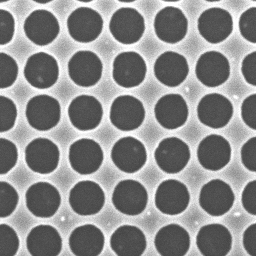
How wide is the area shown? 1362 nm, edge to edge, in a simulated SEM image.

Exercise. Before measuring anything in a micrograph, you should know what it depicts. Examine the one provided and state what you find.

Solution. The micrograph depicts a regular array of holes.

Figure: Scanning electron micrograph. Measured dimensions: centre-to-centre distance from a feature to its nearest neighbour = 223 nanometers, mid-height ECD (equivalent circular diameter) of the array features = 193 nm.